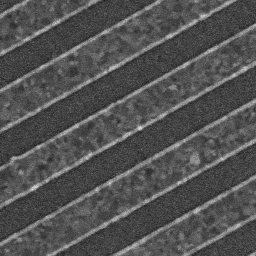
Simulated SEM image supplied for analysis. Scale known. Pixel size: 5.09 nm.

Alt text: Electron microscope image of one or a few lines or trenches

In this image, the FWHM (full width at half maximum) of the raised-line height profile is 173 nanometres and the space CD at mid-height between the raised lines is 32.3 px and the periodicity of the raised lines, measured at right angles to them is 66.5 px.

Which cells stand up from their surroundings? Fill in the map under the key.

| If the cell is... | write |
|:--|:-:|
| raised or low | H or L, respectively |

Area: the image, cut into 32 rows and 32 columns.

LLLHHHHHHHHLLLLLLLLLHHHHHHHHLLLL
LHHHHHHHHLLLLLLLLLHHHHHHHHLLLLLL
HHHHHHHHLLLLLLLLHHHHHHHHHLLLLLLL
HHHHHHLLLLLLLLHHHHHHHHHLLLLLLLLH
HHHHLLLLLLLLHHHHHHHHHLLLLLLLLLHH
HHLLLLLLLLHHHHHHHHHLLLLLLLLLHHHH
HLLLLLLLLHHHHHHHHHLLLLLLLLHHHHHH
LLLLLLLHHHHHHHHHLLLLLLLLHHHHHHHH
LLLLLHHHHHHHHHLLLLLLLLHHHHHHHHHL
LLLHHHHHHHHHLLLLLLLLLHHHHHHHHLLL
LLHHHHHHHHHLLLLLLLLHHHHHHHHLLLLL
HHHHHHHHHLLLLLLLLHHHHHHHHHLLLLLL
HHHHHHHLLLLLLLLHHHHHHHHHLLLLLLLL
HHHHHLLLLLLLLLHHHHHHHHLLLLLLLLHH
HHHLLLLLLLLLHHHHHHHHLLLLLLLLLHHH
HHLLLLLLLLHHHHHHHHLLLLLLLLLHHHHH
LLLLLLLLHHHHHHHHHLLLLLLLLHHHHHHH
LLLLLLHHHHHHHHHLLLLLLLLHHHHHHHHH
LLLLLHHHHHHHHLLLLLLLLHHHHHHHHHLL
LLLHHHHHHHHLLLLLLLLLHHHHHHHHLLLL
LHHHHHHHHHLLLLLLLLHHHHHHHHHLLLLL
HHHHHHHHLLLLLLLLHHHHHHHHHLLLLLLL
HHHHHHLLLLLLLLHHHHHHHHHLLLLLLLLH
HHHHLLLLLLLLHHHHHHHHHLLLLLLLLLHH
HHLLLLLLLLLHHHHHHHHHLLLLLLLLHHHH
HLLLLLLLLHHHHHHHHHLLLLLLLLHHHHHH
LLLLLLLHHHHHHHHHLLLLLLLLHHHHHHHH
LLLLLHHHHHHHHHLLLLLLLLHHHHHHHHHL
LLLLHHHHHHHHLLLLLLLLLHHHHHHHHLLL
LLHHHHHHHHHLLLLLLLLHHHHHHHHHLLLL
HHHHHHHHHLLLLLLLLHHHHHHHHHLLLLLL
HHHHHHHLLLLLLLLHHHHHHHHHLLLLLLLL